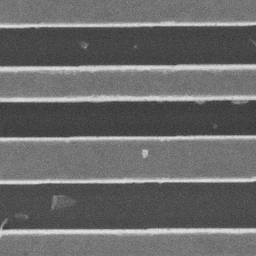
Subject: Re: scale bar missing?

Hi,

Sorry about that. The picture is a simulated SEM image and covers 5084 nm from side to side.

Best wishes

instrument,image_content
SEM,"lines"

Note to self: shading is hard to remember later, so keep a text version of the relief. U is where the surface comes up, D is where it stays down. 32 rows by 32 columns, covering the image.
UUUUUUUUUUUUUUUUUUUUUUUUUUUUUUUU
UUUUUUUUUUUUUUUUUUUUUUUUUUUUUUUU
UUUUUUUUUUUUUUUUUUUUUUUUUUUUUUUU
DDDDDDDDDDDDDDDDDDDDDDDDDDDDDDDD
DDDDDDDDDDDDDDDDDDDDDDDDDDDDDDDD
DDDDDDDDDDDDDDDDDDDDDDDDDDDDDDDD
DDDDDDDDDDDDDDDDDDDDDDDDDDDDDDDD
DDDDDDDDDDDDDDDDDDDDDDDDDDDDDDDD
UUUUUUUUUUUUUUUUUUUUUUUUUUUUUUUU
UUUUUUUUUUUUUUUUUUUUUUUUUUUUUUUU
UUUUUUUUUUUUUUUUUUUUUUUUUUUUUUUU
UUUUUUUUUUUUUUUUUUUUUUUUUUUUUUUU
UUUUUUUUUUUUUUUUUUUUUUDUDDDDDDDD
DDDDDDDDDDDDDDDDDDDDDDDDDDDDDDDD
DDDDDDDDDDDDDDDDDDDDDDDDDDDDDDDD
DDDDDDDDDDDDDDDDDDDDDDDDDDDDDDDD
DDDDDDDDDDDDDDDDDDDDDDDDDDDDDDDD
UUUUUUUUUUUUUUUUUUUUUUUUUUUUUUUU
UUUUUUUUUUUUUUUUUUUUUUUUUUUUUUUU
UUUUUUUUUUUUUUUUUUUUUUUUUUUUUUUU
UUUUUUUUUUUUUUUUUUUUUUUUUUUUUUUU
UUUUUUUUUUUUUUUUUUUUUUUUUUUUUUUU
UUUUUUUUUUUUUUUUUUUUUUUUUUUUUUUU
DDDDDDDDDDDDDDDDDDDDDDDDDDDDDDDD
DDDDDDDDDDDDDDDDDDDDDDDDDDDDDDDD
DDDDDDDDDDDDDDDDDDDDDDDDDDDDDDDD
DDDDDDDDDDDDDDDDDDDDDDDDDDDDDDDD
DDDDDDDDDDDDDDDDDDDDDDDDDDDDDDDD
DDDDDDDDDDDDDDDDDDDDDDDDDDDDDDDD
UUUUUUUUUUUUUUUUUUUUUUUUUUUUUUUU
UUUUUUUUUUUUUUUUUUUUUUUUUUUUUUUU
UUUUUUUUUUUUUUUUUUUUUUUUUUUUUUUU